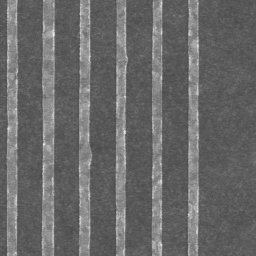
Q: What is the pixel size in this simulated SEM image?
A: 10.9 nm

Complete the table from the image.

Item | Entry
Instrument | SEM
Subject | parallel lines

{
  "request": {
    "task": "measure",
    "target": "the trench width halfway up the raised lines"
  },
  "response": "291 nm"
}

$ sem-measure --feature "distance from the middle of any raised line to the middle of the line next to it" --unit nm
395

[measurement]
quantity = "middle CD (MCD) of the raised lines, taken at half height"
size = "102 nanometres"